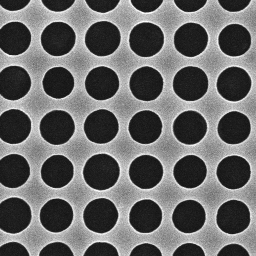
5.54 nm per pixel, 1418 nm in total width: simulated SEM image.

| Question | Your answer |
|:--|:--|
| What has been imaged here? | a regular array of holes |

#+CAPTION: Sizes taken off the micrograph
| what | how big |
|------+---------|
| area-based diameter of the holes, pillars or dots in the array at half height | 189 nanometers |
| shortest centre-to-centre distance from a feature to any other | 241 nanometers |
